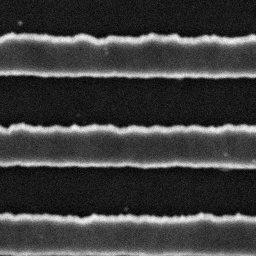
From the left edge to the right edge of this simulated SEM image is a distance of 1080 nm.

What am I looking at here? lines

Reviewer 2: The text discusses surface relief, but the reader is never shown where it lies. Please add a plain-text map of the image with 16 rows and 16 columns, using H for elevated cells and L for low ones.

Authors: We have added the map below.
LLLLLLLLLLLLLLLL
LLLLLLLLLLLLLLLL
HHHHHHHHHHHHHHHH
HHHHHHHHHHHHHHHH
HHHHHHHHHHHHHHHH
LLLLLLLLLLLLLLLL
LLLLLLLLLLLLLLLL
LLLLLLLLLLLLLLLL
HHHHHHHHHHHHHHHH
HHHHHHHHHHHHHHHH
LLLLLLLLLLLLLLHH
LLLLLLLLLLLLLLLL
LLLLLLLLLLLLLLLL
HHHLLLLLLLLLHLHL
HHHHHHHHHHHHHHHH
HHHHHHHHHHHHHHHH